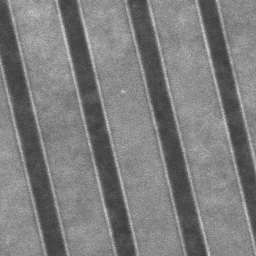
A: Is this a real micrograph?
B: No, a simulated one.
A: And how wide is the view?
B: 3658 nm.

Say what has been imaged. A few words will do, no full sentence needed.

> one or a few lines or trenches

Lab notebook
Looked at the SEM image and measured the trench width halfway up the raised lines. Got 643 nanometers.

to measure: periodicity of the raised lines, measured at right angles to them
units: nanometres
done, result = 972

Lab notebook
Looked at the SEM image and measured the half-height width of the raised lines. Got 334 nanometres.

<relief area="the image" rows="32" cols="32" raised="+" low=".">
+......+++......+++......++.....
+......+++......+++......+++....
++......++......+++......+++....
++......+++.....+++......+++....
++......+++......+++.....+++....
++......+++......+++......++....
+++.....+++......+++......+++...
+++......+++.....+++......+++...
+++......+++......+++.....+++...
+++......+++......+++......++...
.+++.....+++......+++......+++..
.+++......+++.....+++......+++..
.+++......+++......+++.....+++..
.+++......+++......+++......++..
..+++.....+++......+++......+++.
..+++......++......+++......+++.
..+++......+++.....+++......+++.
..+++......+++......+++......++.
..+++......+++......+++......+++
...+++......++......+++......+++
...+++......+++.....+++......+++
...+++......+++......+++......++
...+++......+++......+++......++
....+++.....+++......+++......++
....+++......+++.....+++......++
....+++......+++......+++......+
....+++......+++......+++......+
.....+++.....+++......+++......+
.....+++......++......+++......+
.....+++......+++......+++.....+
.....+++......+++......+++......
......+++.....+++......+++......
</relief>